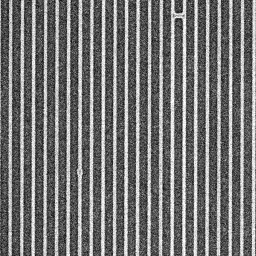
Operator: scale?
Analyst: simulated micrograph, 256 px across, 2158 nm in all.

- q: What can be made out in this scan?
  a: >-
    parallel lines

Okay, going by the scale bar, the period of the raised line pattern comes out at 97.7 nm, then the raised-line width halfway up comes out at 22.1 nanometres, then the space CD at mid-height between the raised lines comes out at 74.8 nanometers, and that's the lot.